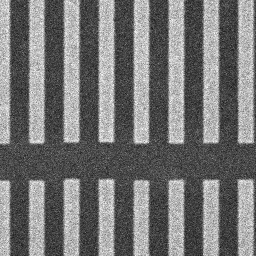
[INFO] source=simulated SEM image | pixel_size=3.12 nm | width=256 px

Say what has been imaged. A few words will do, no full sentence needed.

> parallel lines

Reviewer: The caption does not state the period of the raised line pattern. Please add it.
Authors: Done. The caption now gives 0.109 µm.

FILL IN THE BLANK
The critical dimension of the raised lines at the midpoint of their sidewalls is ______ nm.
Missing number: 46.8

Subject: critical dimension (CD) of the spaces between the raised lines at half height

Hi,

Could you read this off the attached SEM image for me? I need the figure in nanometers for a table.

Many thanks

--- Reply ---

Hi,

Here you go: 61.6